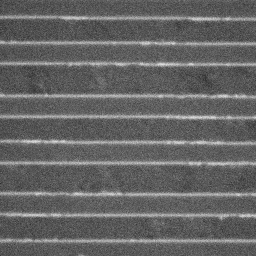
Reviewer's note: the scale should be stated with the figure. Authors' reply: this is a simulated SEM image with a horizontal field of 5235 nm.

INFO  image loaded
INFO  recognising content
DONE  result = lines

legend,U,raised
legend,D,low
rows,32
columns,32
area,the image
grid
UUUUUUUUUUUUUUUUUUUUUUUUUUUUUUUU
UUUUUUUUUUUUUUUUUUUUUUUUUUUUUUUU
DDDDDDDDDDDDDDDDDDDDDDDDDDDDDDDD
DDDDDDDDDDDDDDDDDDDDDDDDDDDDDDDD
DDDDDDDDDDDDDDDDDDDDDDDDDDDDDDDD
UUUUUUUUUUUUUUUUUUUUUUDUUDDDDDDD
UUUUUUUUUUUUUUUUUUUUUUUUUUUUUUUU
UUUUUUUUUUUUUUUUUUUUUUUUUUUUUUUU
DDDDDDDDDDDDDDDDDDDDDDDDDDDDDDDD
DDDDDDDDDDDDDDDDDDDDDDDDDDDDDDDD
DDDDDDDDDDDDDDDDDDDDDDDDDDDDDDDD
DDDDDDDDDDDDDDDDDDDDDDDDDDDDDDDD
UUUUUUUUUUUUUUUUUUUUUUUUUUUUUUUU
UUUUUUUUUUUUUUUUUUUUUUUUUUUUUUUU
UUUUUUUUUUUUUUUUUUUUUUUUUUUUUUUU
DDDDDDDDDDDDDDDDDDDDDDDDDDDDDDDD
DDDDDDDDDDDDDDDDDDDDDDDDDDDDDDDD
DDDDDDDDDDDDDDDDDDDDDDDDDDDDDDDD
UUUUUUUUUUUUUUUUUUUUUUUUUUUUUUUU
UUUUUUUUUUUUUUUUUUUUUUUUUUUUUUUU
DDDDDDDDDDDDDDDDDDDDDDDDDDDDDDDD
DDDDDDDDDDDDDDDDDDDDDDDDDDDDDDDD
DDDDDDDDDDDDDDDDDDDDDDDDDDDDDDDD
DDDDDDDDDDDDDDDDDDDDDDDDDDDDDDDD
UUUUUUUUUUUUUUUUUUUUUUUUUUUUUUUU
UUUUUUUUUUUUUUUUUUUUUUUUUUUUUUUU
UUUUUUUUUUUUUUUUUUUUUUUUUUUUUUUU
DDDDDDDDDDDDDDDDDDDDDDDDDDDDDDDD
DDDDDDDDDDDDDDDDDDDDDDDDDDDDDDDD
DDDDDDDDDDDDDDDDDDDDDDDDDDDDDDDD
UUUUUUUUUUUUUUUUUUUUUUUUUUUUUUUU
UUUUUUUUUUUUUUUUUUUUUUUUUUUUUUUU